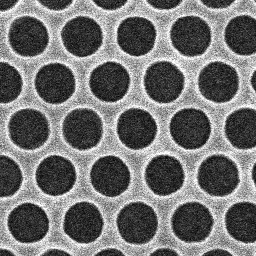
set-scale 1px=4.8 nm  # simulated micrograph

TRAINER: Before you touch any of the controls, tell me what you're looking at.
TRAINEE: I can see a regular array of holes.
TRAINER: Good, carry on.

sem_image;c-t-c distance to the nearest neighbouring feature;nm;257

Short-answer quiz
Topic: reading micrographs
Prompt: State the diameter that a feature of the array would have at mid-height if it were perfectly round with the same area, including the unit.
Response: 41.1 pixels